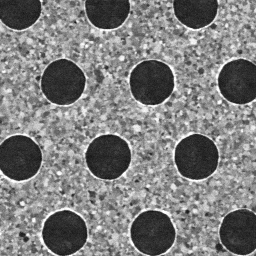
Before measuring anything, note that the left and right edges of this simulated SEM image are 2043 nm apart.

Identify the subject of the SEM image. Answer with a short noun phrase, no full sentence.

holes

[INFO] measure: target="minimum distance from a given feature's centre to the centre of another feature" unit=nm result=692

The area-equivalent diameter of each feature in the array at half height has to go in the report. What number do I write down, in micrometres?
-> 0.368